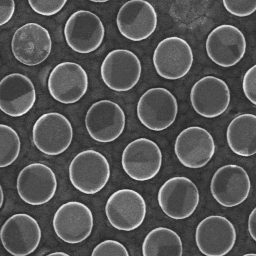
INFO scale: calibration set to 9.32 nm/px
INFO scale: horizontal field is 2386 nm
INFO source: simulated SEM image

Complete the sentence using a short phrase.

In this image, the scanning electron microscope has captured a regular array of raised bodies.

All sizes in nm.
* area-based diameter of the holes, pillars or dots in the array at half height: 366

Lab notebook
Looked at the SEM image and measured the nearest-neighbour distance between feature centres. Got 494 nm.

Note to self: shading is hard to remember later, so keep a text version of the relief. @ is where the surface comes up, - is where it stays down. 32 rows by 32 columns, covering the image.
@@--@@@@--------@@@---------@@@@
@@---@@---@----@@@@----------@@-
@--------@@@---@@@@-------------
--------@@@@@--@@@@--------@@---
--------@@@@@---@@--------@@@@--
---------@@@--------@@@---@@@@@-
----------@---@@---@@@@@--@@@@@-
-------------@@@@--@@@@@---@@@--
-------@@@---@@@@---@@@@--------
-@@---@@@@@--@@@@---@@@--------@
@@@@--@@@@@--@@@@--------@@@--@@
@@@@--@@@@--------@@@---@@@@@--@
@@@@---@@@--------@@@@--@@@@@--@
@@@@-------@@@@--@@@@@--@@@@----
-----@@@---@@@@--@@@@@----@---@@
----@@@@@--@@@@---@@@--------@@@
@@--@@@@@--@@@@--------@@@--@@@@
@@--@@@@@---@@---@----@@@@@--@@@
@@---@@@--------@@@@--@@@@@--@@@
@@--------@@@--@@@@@--@@@@------
@--------@@@@--@@@@@---@@-------
---@@@---@@@@@--@@@@-------@@@@-
--@@@@@--@@@@--------@@----@@@@-
--@@@@@---@@@-------@@@@@-@@@@@-
---@@@--------@@@---@@@@@--@@@@-
--------@@---@@@@@--@@@@@---@@--
-------@@@@--@@@@@---@@@--------
-@@@---@@@@---@@@@--------@@---@
@@@@@--@@@@----@@--------@@@@--@
@@@@@--@@@@--------@@@---@@@@---
@@@@@--------@@---@@@@@--@@@@---
-@@@--------@@@@--@@@@@--@@@----